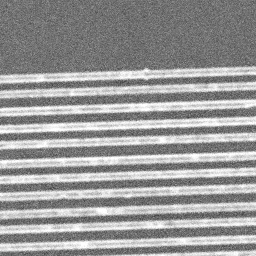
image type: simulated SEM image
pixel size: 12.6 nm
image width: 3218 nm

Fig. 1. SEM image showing parallel lines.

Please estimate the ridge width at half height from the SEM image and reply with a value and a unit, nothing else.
73.8 nanometres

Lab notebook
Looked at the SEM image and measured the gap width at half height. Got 140 nanometres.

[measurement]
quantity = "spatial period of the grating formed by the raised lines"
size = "212 nm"